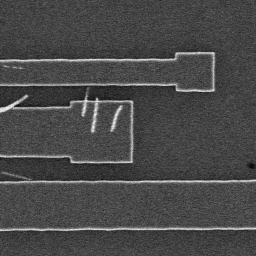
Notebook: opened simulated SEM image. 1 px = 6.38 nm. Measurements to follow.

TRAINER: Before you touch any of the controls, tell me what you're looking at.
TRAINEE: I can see groups of lines, slits or small figures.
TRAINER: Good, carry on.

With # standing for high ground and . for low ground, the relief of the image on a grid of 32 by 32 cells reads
................................
................................
................................
................................
................................
................................
................................
.....######################.....
###########################.....
###########################.....
###########################.....
................................
................................
#################...............
#################...............
#################...............
#################...............
#################...............
#################...............
#################...............
................................
................................
................................
################################
################################
################################
################################
################################
################################
................................
................................
................................